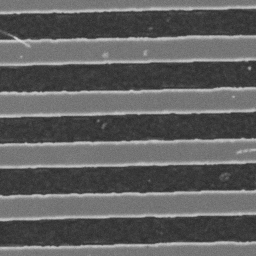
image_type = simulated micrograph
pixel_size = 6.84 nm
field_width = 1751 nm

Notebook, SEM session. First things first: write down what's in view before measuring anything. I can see lines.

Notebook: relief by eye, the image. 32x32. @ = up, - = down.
@@@@@@@@@@@@@@@@@@@@@@@@@@@@@@@@
@@@@@@--@-----------------------
--------------------------------
--------------------------------
------------------------@-@@@@@@
@@@@@@@@@@@@@@@@@@@@@@@@@@@@@@@@
@@@@@@@@@@@@@@@@@@@@@@@@@@@@@@@@
@@@@@@@@@@@@@@@@@@@@@@@@@@@@@@--
--------------------------------
--------------------------------
--------------------------------
--------@-@@@@@@@@@@@@@@@@@@@@@@
@@@@@@@@@@@@@@@@@@@@@@@@@@@@@@@@
@@@@@@@@@@@@@@@@@@@@@@@@@@@@@@@@
@@@@@@@-------------------------
--------------------------------
--------------------------------
---------------------------@@@@@
@@@@@@@@@@@@@@@@@@@@@@@@@@@@@@@@
@@@@@@@@@@@@@@@@@@@@@@@@@@@@@@@@
@@@@@@@@@@@@@@@@@@@@@@@@-@------
--------------------------------
--------------------------------
--------------------------------
-@@@@@@@@@@@@@@@@@@@@@@@@@@@@@@@
@@@@@@@@@@@@@@@@@@@@@@@@@@@@@@@@
@@@@@@@@@@@@@@@@@@@@@@@@@@@@@@@@
@-------------------------------
--------------------------------
--------------------------------
-------------------@@@@@@@@@@@@@
@@@@@@@@@@@@@@@@@@@@@@@@@@@@@@@@